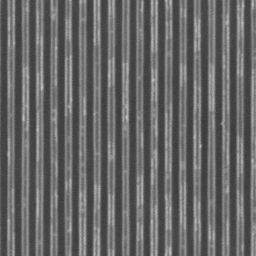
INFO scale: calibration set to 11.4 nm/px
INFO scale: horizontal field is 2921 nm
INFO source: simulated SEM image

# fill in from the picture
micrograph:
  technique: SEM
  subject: parallel lines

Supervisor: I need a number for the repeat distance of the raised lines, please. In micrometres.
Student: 0.164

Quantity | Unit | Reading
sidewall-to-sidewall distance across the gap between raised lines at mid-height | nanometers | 95.6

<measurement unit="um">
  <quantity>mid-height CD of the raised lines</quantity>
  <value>0.0642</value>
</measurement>